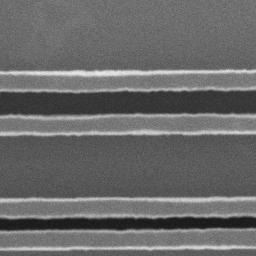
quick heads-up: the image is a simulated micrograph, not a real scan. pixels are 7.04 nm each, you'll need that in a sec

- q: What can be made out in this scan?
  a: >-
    lines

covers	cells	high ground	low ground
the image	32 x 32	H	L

LLLLLLLLLLLLLLLLLLLLLLLLLLLLLLLL
LLLLLLLLLLLLLLLLLLLLLLLLLLLLLLLL
LLLLLLLLLLLLLLLLLLLLLLLLLLLLLLLL
LLLLLLLLLLLLLLLLLLLLLLLLLLLLLLLL
LLLLLLLLLLLLLLLLLLLLLLLLLLLLLLLL
LLLLLLLLLLLLLLLLLLLLLLLLLLLLLLLL
LLLLLLLLLLLLLLLLLLLLLLLLLLLLLLLL
LLLLLLLLLLLLLLLLLLLLLLLLLLLLLLLL
LLLLLLLLLLLLLLLLLLLLLLLLLLLLLLLL
HHHHHHHHHHHHHHHHHHHHHHHHHHHHHHHH
HHHHHHHHHHHHHHHHHHHHHHHHHHHHHHHH
LLHLHHHHHHHHLLLLLLLLLLLLLLLLLLLL
LLLLLLLLLLLLLLLLLLLLLLLLLLLLLLLL
LLLLLLLLLLLLLLLLLLLLLLLLLLLLLLLL
HHHHHHLHHHHHHHHHHHHHHHHHHHHHHHHH
HHHHHHHHHHHHHHHHHHHHHHHHHHHHHHHH
HHHHHHHHHHHHHHHHHHHHHHHHHHHHHHHH
LLLLLLLLLLLLLLLLLLLLLLLLLLLLLLLL
LLLLLLLLLLLLLLLLLLLLLLLLLLLLLLLL
LLLLLLLLLLLLLLLLLLLLLLLLLLLLLLLL
LLLLLLLLLLLLLLLLLLLLLLLLLLLLLLLL
LLLLLLLLLLLLLLLLLLLLLLLLLLLLLLLL
LLLLLLLLLLLLLLLLLLLLLLLLLLLLLLLL
LLLLLLLLLLLLLLLLLLLLLLLLLLLLLLLL
LLLLLLLLLLLLLLLLLLLLLLLLLLLLLLLL
HHHHHHHHHHHHHHHHHHHHHHHHHHHHHHHH
HHHHHHHHHHHHHHHHHHHHHHHHHHHHHHHH
LLLLLLLLLLLLLLLLLLLLLLLLLLLLLLLL
LLLLLLLLLLLLLLLLLLLLLLLLLLLLLLLL
HHHHHHHHHHHHHHHHHHHHHHHHHHHHHHHH
HHHHHHHHHHHHHHHHHHHHHHHHHHHHHHHH
LLLLLLLLLLLLLLLLLLLLLLLLLLLLLLLL